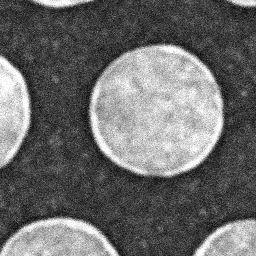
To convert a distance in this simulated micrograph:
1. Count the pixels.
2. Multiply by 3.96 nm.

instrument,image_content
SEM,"raised bodies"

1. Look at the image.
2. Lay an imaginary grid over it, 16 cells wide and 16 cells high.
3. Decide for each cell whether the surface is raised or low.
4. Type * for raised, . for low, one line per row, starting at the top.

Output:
................
................
................
........****....
*......******...
**....********..
**....********..
**....********..
*.....********..
*......******...
........****....
................
................
................
.*****.......***
*******......***